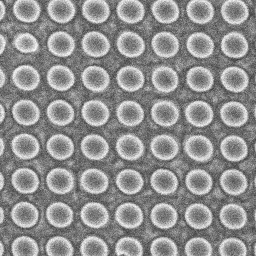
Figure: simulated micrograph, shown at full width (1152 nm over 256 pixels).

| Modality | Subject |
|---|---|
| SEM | a regular array of raised bodies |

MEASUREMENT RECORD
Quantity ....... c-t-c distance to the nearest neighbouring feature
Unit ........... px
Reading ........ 34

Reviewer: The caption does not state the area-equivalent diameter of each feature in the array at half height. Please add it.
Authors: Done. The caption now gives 116 nm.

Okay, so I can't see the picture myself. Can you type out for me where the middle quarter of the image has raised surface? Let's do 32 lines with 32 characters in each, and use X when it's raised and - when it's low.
--------------------------------
X----XXXXX----XXXXX----XXXX----X
XX---XXXXXX--XXXXXXX--XXXXXX---X
XX---XXXXXX--XXXXXXX--XXXXXX---X
XX---XXXXXX---XXXXXX--XXXXXX---X
XX---XXXXXX---XXXXX----XXXXX---X
-------XX-------XX------XXX-----
--------------------------------
--------------------------------
------XXX------XXX--------------
XX---XXXXX----XXXXX---XXXXXX---X
XX---XXXXXX--XXXXXXX--XXXXXX--XX
XX---XXXXXX--XXXXXXX--XXXXXXX-XX
XX---XXXXXX---XXXXXX--XXXXXX---X
XX----XXXX----XXXXX----XXXXX---X
-------------------------X------
--------------------------------
--------------------------------
X----XXXXX----XXXX-----XXXX-----
XX---XXXXXX--XXXXXX---XXXXXX---X
XX--XXXXXXX--XXXXXXX--XXXXXX---X
XX--XXXXXXX--XXXXXXX--XXXXXX---X
XX---XXXXXX---XXXXX---XXXXXX---X
X-----XXX------XXX-----XXXX-----
--------------------------------
--------------------------------
------XX--------X-------X-------
XX---XXXXX----XXXXX---XXXXX----X
XX--XXXXXXX--XXXXXX---XXXXXX---X
XX--XXXXXXX--XXXXXXX--XXXXXX---X
XX---XXXXXX--XXXXXXX--XXXXXX---X
XX----XXXX----XXXXX----XXXXX---X